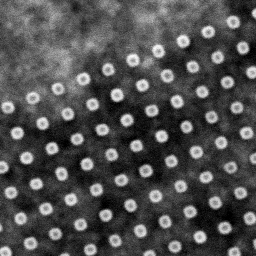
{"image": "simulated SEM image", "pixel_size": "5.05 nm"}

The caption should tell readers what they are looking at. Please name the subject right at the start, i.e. a regular array of raised bodies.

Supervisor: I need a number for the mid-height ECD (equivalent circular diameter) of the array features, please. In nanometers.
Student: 57.6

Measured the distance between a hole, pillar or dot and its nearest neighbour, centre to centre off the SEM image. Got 135 nanometers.